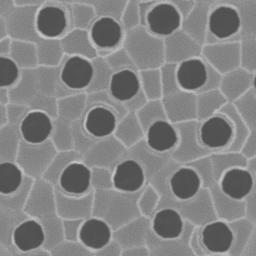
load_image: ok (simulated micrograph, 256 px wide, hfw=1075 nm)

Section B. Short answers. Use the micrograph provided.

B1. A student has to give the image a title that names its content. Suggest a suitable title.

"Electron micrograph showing a regular array of holes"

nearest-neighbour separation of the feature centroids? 0.218 um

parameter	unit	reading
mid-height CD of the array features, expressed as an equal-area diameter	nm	124